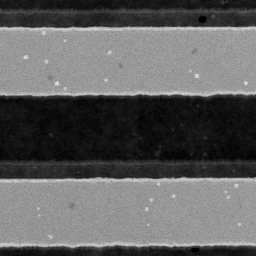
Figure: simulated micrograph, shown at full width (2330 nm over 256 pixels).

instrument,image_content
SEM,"lines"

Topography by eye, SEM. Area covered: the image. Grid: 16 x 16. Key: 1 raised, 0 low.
0000000000000000
0000000000000000
1111111111111111
1111111111111111
1111111111111111
1111111111111111
0000000000000000
0000000000000000
0000000000000000
0000000000000000
0000000000000000
1111111111111111
1111111111111111
1111111111111111
1111111111111111
0000000000000000